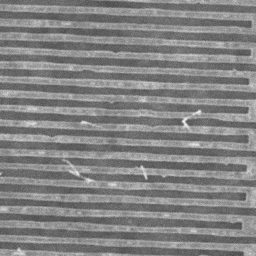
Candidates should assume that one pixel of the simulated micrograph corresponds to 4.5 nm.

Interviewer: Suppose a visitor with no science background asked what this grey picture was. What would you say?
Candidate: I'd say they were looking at parallel lines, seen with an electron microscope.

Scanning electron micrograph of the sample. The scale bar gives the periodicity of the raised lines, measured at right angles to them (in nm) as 64.9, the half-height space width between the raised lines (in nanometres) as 34.8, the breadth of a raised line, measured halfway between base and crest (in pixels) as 6.62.